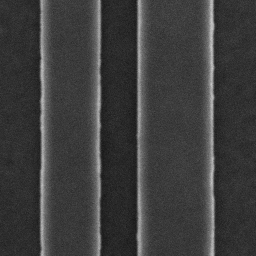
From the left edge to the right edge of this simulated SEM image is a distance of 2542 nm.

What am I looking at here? lines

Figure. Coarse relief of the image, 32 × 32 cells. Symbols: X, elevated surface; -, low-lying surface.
-----XXXXXXX-----XXXXXXXXXX-----
-----XXXXXXX-----XXXXXXXXXX-----
-----XXXXXXXX----XXXXXXXXXX-----
-----XXXXXXXX----XXXXXXXXXX-----
-----XXXXXXX-----XXXXXXXXXX-----
-----XXXXXXX-----XXXXXXXXX------
-----XXXXXXX-----XXXXXXXXXX-----
-----XXXXXXX-----XXXXXXXXXX-----
-----XXXXXXX-----XXXXXXXXXX-----
-----XXXXXXX-----XXXXXXXXXX-----
-----XXXXXXX-----XXXXXXXXXX-----
-----XXXXXXXX----XXXXXXXXXX-----
-----XXXXXXX-----XXXXXXXXXX-----
-----XXXXXXX-----XXXXXXXXXX-----
-----XXXXXXX-----XXXXXXXXXX-----
-----XXXXXXX-----XXXXXXXXXX-----
-----XXXXXXX-----XXXXXXXXXX-----
-----XXXXXXX-----XXXXXXXXXX-----
-----XXXXXXX-----XXXXXXXXXX-----
-----XXXXXXX-----XXXXXXXXXX-----
-----XXXXXXX-----XXXXXXXXXX-----
-----XXXXXXX-----XXXXXXXXXX-----
-----XXXXXXX-----XXXXXXXXX------
-----XXXXXXX-----XXXXXXXXXX-----
-----XXXXXXX-----XXXXXXXXXX-----
-----XXXXXXX-----XXXXXXXXXX-----
-----XXXXXXX-----XXXXXXXXXX-----
-----XXXXXXX-----XXXXXXXXXX-----
-----XXXXXXX-----XXXXXXXXXX-----
-----XXXXXXX-----XXXXXXXXXX-----
-----XXXXXXX-----XXXXXXXXXX-----
-----XXXXXXX-----XXXXXXXXXX-----